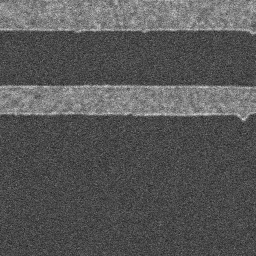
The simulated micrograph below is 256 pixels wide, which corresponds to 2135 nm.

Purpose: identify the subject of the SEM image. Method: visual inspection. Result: one or a few lines or trenches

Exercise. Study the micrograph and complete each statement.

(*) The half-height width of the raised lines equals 234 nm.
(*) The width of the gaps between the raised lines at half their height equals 0.475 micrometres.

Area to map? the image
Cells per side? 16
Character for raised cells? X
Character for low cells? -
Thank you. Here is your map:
XXXXXXXXXXXXXXXX
XXXXXXXXXXXXXXXX
----------------
----------------
----------------
XXXXXXXXXXXXXXXX
XXXXXXXXXXXXXXXX
----------------
----------------
----------------
----------------
----------------
----------------
----------------
----------------
----------------